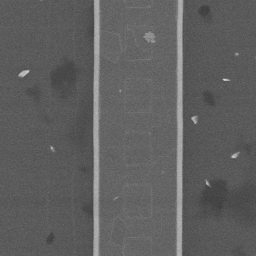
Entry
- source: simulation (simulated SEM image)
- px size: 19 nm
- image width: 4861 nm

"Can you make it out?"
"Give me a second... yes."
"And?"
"wiring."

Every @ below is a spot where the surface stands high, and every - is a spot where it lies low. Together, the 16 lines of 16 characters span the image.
------@@@@@-----
------@@@@@-----
------@@@@@-----
------@@@@@-----
------@@@@@-----
------@@@@@-----
------@@@@@-----
------@@@@@-----
------@@@@@-----
------@@@@@-----
------@@@@@-----
------@@@@@-----
------@@@@@-----
------@@@@@-----
------@@@@@-----
------@@@@@-----